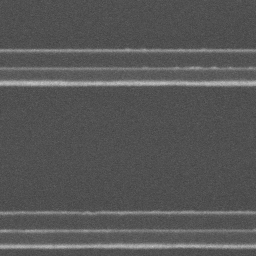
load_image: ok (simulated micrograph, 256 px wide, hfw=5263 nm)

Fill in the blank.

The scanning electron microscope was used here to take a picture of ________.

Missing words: lines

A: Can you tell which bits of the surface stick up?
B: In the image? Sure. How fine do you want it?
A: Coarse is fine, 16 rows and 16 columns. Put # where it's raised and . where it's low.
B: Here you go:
................
................
................
################
################
................
................
................
................
................
................
................
................
################
################
................